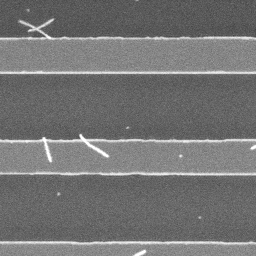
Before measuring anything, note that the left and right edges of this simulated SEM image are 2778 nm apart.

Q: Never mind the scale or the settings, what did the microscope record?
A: lines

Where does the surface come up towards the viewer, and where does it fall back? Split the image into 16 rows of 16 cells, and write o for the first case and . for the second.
................
................
oooooooooooooooo
oooooooooooooooo
oooooooooooooooo
................
................
................
................
oooooooooooooooo
oooooooooooooooo
................
................
................
................
oooooooooooooooo